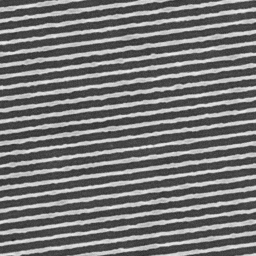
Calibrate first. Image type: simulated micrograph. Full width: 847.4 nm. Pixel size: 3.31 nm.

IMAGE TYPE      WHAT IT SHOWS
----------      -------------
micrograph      parallel lines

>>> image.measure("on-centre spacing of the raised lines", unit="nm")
36.7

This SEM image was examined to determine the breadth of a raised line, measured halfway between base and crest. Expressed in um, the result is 0.0094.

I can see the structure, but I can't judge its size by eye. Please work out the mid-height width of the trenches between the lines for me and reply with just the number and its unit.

0.025 um